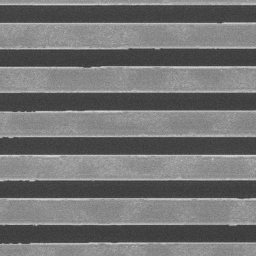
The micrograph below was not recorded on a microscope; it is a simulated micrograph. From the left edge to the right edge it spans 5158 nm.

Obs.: lines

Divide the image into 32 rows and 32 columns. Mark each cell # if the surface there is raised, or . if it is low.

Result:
################################
................................
................................
################################
################################
################################
................................
................................
##########..####################
################################
################################
################################
................................
................................
################################
################################
################################
................................
................................
................................
################################
################################
................................
................................
................................
################################
################################
################################
................................
................................
....#..#.#######################
################################